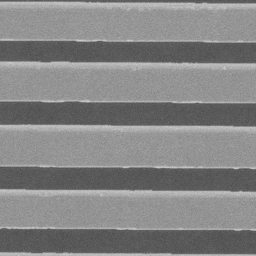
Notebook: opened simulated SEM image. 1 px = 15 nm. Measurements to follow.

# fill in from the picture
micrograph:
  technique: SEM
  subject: lines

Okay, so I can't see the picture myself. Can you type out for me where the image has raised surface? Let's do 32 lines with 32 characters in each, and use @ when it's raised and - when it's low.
--------------------------------
@@@@@@@@@@@@@@@@@@@@@@@@@@@@@@@@
@@@@@@@@@@@@@@@@@@@@@@@@@@@@@@@@
@@@@@@@@@@@@@@@@@@@@@@@@@@@@@@@@
@@@@@@@@@@@@@@@@@@@@@@@@@@@@@@@@
--------------------------------
--------------------------------
--------------------------------
@@@@@@@@@@@@@@@@@@@@@@@@@@@@@@@@
@@@@@@@@@@@@@@@@@@@@@@@@@@@@@@@@
@@@@@@@@@@@@@@@@@@@@@@@@@@@@@@@@
@@@@@@@@@@@@@@@@@@@@@@@@@@@@@@@@
@@@@@@@@@@@@@@@@@@@@@@@@@@@@@@@@
--------------------------------
--------------------------------
--------------------------------
@@@@@@@@@@@@@@@@@@@@@@@@@@@@@@@@
@@@@@@@@@@@@@@@@@@@@@@@@@@@@@@@@
@@@@@@@@@@@@@@@@@@@@@@@@@@@@@@@@
@@@@@@@@@@@@@@@@@@@@@@@@@@@@@@@@
@@@@@@@@@@@@@@@@@@@@@@@@@@@@@@@@
--------------------------------
--------------------------------
--------------------------------
@@@@@@@@@@@@@@@@@@@@@@@@@@@@@@@@
@@@@@@@@@@@@@@@@@@@@@@@@@@@@@@@@
@@@@@@@@@@@@@@@@@@@@@@@@@@@@@@@@
@@@@@@@@@@@@@@@@@@@@@@@@@@@@@@@@
@@@@@@@@@@@@@@@@@@@@@@@@@@@@@@@@
--------------------------------
--------------------------------
--------------------------------